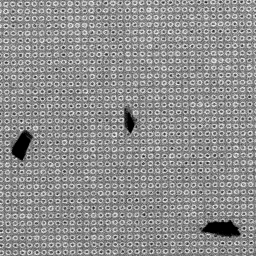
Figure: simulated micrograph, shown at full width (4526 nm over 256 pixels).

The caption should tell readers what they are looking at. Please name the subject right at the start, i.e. a regular array of holes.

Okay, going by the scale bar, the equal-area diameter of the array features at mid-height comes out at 0.0631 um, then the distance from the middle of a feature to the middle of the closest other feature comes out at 124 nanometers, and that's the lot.